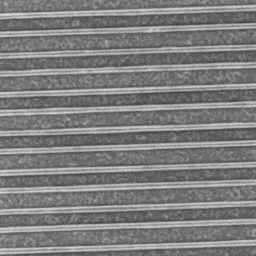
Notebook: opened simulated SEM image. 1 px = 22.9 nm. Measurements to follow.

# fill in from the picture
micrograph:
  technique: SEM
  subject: parallel lines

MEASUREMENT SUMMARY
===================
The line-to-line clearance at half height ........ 346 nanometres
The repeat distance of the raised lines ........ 447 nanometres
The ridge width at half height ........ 88.6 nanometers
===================